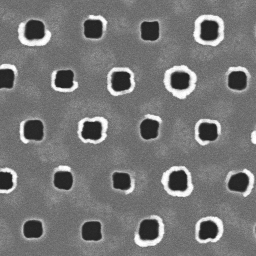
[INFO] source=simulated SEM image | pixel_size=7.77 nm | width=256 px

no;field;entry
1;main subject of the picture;a regular array of holes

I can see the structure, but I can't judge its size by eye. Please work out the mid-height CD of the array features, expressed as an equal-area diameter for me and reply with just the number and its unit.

157 nm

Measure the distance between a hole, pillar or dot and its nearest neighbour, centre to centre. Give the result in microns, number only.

0.443